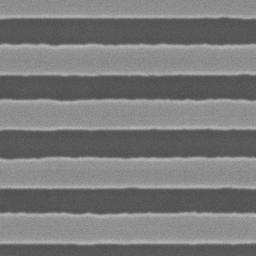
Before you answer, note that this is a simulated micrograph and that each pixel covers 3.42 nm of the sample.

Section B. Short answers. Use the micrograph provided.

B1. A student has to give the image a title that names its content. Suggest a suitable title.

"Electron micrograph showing lines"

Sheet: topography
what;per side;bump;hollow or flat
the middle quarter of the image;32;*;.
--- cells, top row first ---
********************************
********************************
********************************
................................
................................
................................
................................
................................
................................
********************************
********************************
********************************
********************************
********************************
********************************
********************************
................................
................................
................................
................................
................................
................................
................................
**..****...........*..*....**..*
********************************
********************************
********************************
********************************
********************************
********************************
********************************
................................